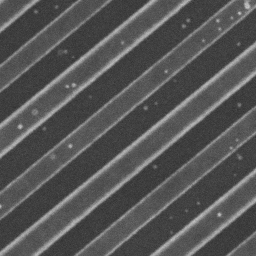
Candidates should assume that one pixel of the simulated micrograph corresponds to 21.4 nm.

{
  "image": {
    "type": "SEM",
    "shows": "lines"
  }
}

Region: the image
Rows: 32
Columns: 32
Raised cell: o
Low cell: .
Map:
oooo.....oooo.....ooooo.....oooo
ooo.....oooo.....ooooo.....oooo.
oo.....oooo.....ooooo.....oooo..
o.....oooo.....ooooo.....oooo...
....oooo.....ooooo......oooo....
...oooo.....ooooo.....oooo......
..oooo.....ooooo.....oooo.....oo
.oooo.....ooooo.....oooo.....ooo
oooo.....ooooo.....oooo.....oooo
oo.....ooooo......oooo.....ooooo
o.....ooooo.....oooo......ooooo.
.....ooooo.....oooo.....ooooo...
....ooooo.....oooo.....ooooo....
...ooooo.....oooo.....ooooo.....
.ooooo......oooo.....ooooo....oo
ooooo.....oooo......ooooo....ooo
oooo.....oooo.....ooooo.....oooo
ooo.....oooo.....ooooo.....oooo.
oo.....oooo.....ooooo.....oooo..
.....ooooo.....ooooo....ooooo...
....oooo.....ooooo.....oooo.....
...oooo.....ooooo.....oooo......
..oooo.....ooooo.....oooo.....oo
.oooo.....ooooo.....oooo.....ooo
oooo.....ooooo....oooo......oooo
oo.....ooooo.....oooo......ooooo
o.....ooooo.....oooo.....ooooo..
.....ooooo.....oooo.....ooooo...
....ooooo.....oooo.....ooooo....
..oooooo....oooo......ooooo....o
.ooooo.....oooo......ooooo....oo
ooooo.....oooo.....ooooo.....ooo